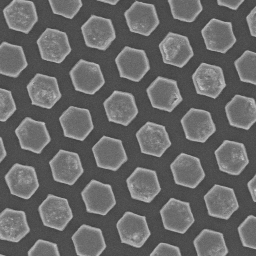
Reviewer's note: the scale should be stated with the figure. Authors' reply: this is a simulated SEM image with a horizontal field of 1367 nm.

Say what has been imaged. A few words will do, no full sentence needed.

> a regular array of raised bodies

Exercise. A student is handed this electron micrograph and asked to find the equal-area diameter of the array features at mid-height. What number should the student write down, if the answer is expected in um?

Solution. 0.175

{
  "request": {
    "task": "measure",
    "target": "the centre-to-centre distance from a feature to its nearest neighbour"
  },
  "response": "45.3 px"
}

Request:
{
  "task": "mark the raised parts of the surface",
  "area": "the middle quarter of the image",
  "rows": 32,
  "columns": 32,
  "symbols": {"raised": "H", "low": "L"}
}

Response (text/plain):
LLLHHHHHHLLLLHHHHHHHHLLLLLLLHHLL
LLHHHHHHHLLLLLHHHHHHHLLLLLLLLLLL
LLHHHHHHHLLLLLHHHHHHLLLLLLLLLLLL
LLHHHHHHHHLLLLLLHHHLLLLHLLLLLLLL
LLHHHHHHHHLLLLLLLLLLLLHHHHHHLLLL
LLLHHHHHHHLLLLLLLLLLLLHHHHHHLLLL
LLLHHHHHHLLLLLLLLLLLLHHHHHHHHLLL
LLLLLLHLLLLLHHHHLLLLLHHHHHHHHLLL
LLLLLLLLLLLHHHHHHLLLLHHHHHHHHLLL
LLLLLLLLLLHHHHHHHHLLLLHHHHHHHLLL
LLLLLLLLLLHHHHHHHHLLLLHHHHHHLLLL
LHHHHHLLLLHHHHHHHHLLLLLLLHHLLLLL
HHHHHHHLLLLHHHHHHHLLLLLLLLLLLLLH
HHHHHHHLLLLHHHHHHLLLLLLLLLLLLLHH
HHHHHHHLLLLLLHHHLLLLLLLLLLLLLHHH
HHHHHHHLLLLLLLLLLLLLHHHHLLLLLLHH
HHHHHHHLLLLLLLLLLLLHHHHHHLLLLLHH
HHHHHHLLLLLLLLLLLLHHHHHHHHLLLLHH
LLHHHLLLLHHHLLLLLLHHHHHHHHLLLLLH
LLLLLLLLHHHHHHLLLLLHHHHHHHHLLLLL
LLLLLLLHHHHHHHHLLLLHHHHHHHLLLLLL
LLLLLLLHHHHHHHHLLLLHHHHHHLLLLLLL
HHHLLLLHHHHHHHHLLLLLLHHHHLLLLHLL
HHHHLLLLHHHHHHHLLLLLLLLLLLLLHHHH
HHHHLLLLHHHHHHHLLLLLLLLLLLLLHHHH
HHHHLLLLLHHHHHLLLLLLLLLLLLLHHHHH
HHHHHLLLLLLLHLLLLLHHHLLLLLLHHHHH
HHHHLLLLLLLLLLLLLHHHHHHLLLLHHHHH
HHHLLLLLLLLLLLLLHHHHHHHLLLLHHHHH
HHHLLLLHHLLLLLLLHHHHHHHHLLLLHHHH
LLLLLLHHHHHLLLLLHHHHHHHHLLLLLLHH
LLLLLHHHHHHHLLLLHHHHHHHHLLLLLLLL